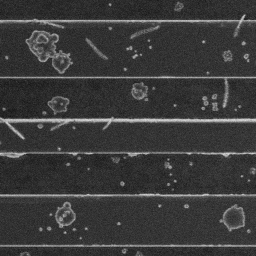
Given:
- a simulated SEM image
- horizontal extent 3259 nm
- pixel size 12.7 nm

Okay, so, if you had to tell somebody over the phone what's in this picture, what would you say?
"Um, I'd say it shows lines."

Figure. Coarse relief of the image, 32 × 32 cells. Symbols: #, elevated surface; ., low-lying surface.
................................
................................
....#.........................#.
################################
################################
################################
################################
################################
################################
################################
................................
................................
................................
................................
................................
################################
################################
################################
################################
................................
................................
................................
................................
................................
################################
################################
################################
################################
################################
################################
################################
................................